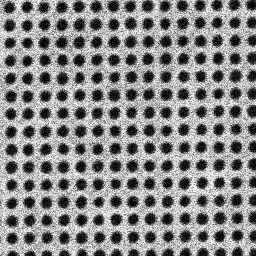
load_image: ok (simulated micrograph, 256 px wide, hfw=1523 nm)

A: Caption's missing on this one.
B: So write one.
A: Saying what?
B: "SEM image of a regular array of holes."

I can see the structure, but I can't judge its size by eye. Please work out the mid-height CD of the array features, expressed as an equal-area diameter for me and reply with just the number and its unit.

0.0701 microns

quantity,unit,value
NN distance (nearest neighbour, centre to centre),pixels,17.1